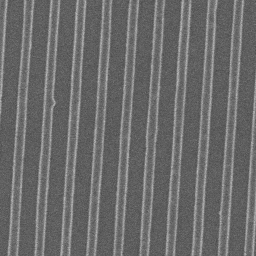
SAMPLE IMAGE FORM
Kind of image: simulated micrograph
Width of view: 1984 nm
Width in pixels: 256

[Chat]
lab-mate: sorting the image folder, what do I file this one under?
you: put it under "parallel lines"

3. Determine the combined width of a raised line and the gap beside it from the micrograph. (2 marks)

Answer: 203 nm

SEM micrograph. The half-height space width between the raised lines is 137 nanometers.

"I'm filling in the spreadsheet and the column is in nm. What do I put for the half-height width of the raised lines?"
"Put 65.8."